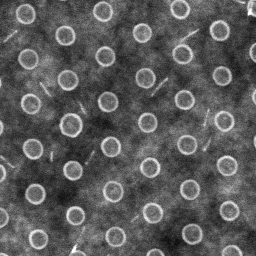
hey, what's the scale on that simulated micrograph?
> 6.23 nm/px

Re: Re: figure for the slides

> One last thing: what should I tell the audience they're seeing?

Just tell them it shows a regular array of raised bodies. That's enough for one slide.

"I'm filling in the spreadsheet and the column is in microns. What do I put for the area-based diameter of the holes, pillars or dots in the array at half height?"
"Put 0.121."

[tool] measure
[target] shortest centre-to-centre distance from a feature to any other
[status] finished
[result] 274 nanometres